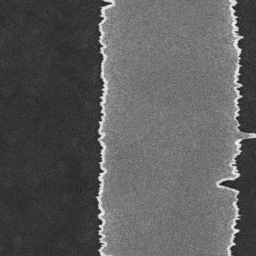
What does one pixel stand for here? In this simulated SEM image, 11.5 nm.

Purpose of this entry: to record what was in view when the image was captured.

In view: one or a few lines or trenches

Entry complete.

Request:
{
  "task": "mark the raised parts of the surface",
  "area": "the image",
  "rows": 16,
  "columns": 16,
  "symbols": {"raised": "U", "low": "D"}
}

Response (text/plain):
DDDDDDDUUUUUUUUD
DDDDDDUUUUUUUUUD
DDDDDDUUUUUUUUUD
DDDDDDUUUUUUUUUD
DDDDDDUUUUUUUUUD
DDDDDDUUUUUUUUUD
DDDDDDUUUUUUUUUD
DDDDDDUUUUUUUUUD
DDDDDDUUUUUUUUUD
DDDDDDUUUUUUUUUD
DDDDDDUUUUUUUUUD
DDDDDDUUUUUUUUDD
DDDDDDUUUUUUUUUD
DDDDDDUUUUUUUUUD
DDDDDDUUUUUUUUUD
DDDDDDUUUUUUUUDD